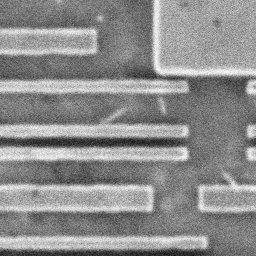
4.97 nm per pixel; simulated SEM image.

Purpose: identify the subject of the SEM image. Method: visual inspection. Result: wiring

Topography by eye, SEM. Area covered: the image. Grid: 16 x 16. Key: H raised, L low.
LLLLLLLLLLHHHHHH
LLLLLLLLLLHHHHHH
LLLLLLLLLLHHHHHH
LLLLLLLLLLHHHHHH
LLLLLLLLLLHHHHHH
LLLLLLLLLLLLLLLL
LLLLLLLLLLLLLLLL
LLLLLLLLLLLLLLLL
LLLLLLLLLLLLLLLL
LLLLLLLLLLLLLLLL
LLLLLLLLLLLLLLLL
LLLLLLLLLLLLLLLL
LLLLLLLLLLLLLLLL
LLLLLLLLLLLLLLLL
LLLLLLLLLLLLLLLL
LLLLLLLLLLLLLLLL